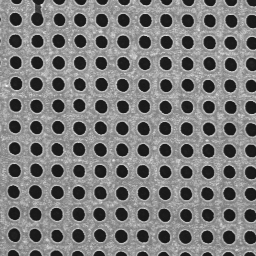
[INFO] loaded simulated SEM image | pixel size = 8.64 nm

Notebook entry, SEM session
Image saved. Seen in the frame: a regular array of holes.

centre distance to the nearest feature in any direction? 182 nanometers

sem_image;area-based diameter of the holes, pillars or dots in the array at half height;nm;110